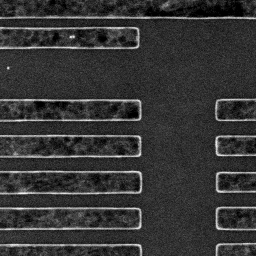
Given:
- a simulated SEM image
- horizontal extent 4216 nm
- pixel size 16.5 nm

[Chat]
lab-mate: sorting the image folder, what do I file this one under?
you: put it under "wiring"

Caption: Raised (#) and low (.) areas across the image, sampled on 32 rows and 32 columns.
################################
################################
................................
#.........#######...............
#################...............
#################...............
................................
................................
................................
................................
................................
................................
...........................#####
##################.........#####
##################.........#####
................................
................................
##################.........#####
##################.........#####
##########.#####................
................................
....####........#...............
##################.........#####
##################.........#####
................................
................................
##################.........#####
##################.........#####
#################..........#####
................................
................................
##################.........#####